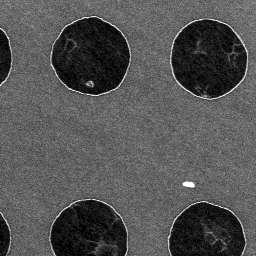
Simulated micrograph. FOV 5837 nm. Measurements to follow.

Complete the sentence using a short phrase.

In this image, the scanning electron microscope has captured raised bodies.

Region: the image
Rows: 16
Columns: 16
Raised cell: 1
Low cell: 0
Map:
0000000000000000
0000111000001100
1000111100011110
1001111100011110
1001111100011110
0000111000001110
0000000000000000
0000000000000000
0000000000000000
0000000000000000
0000000000000000
0000000000000000
0000010000000000
0000111000011110
1001111100011110
1001111100011110